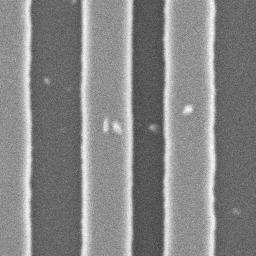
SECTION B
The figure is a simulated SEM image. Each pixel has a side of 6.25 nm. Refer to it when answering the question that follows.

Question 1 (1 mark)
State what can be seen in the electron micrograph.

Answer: lines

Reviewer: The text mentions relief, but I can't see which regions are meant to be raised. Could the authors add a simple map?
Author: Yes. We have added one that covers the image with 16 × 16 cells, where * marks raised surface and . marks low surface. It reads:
**...***..***...
**...***..***...
**...***..***...
**...***..***...
**...***..***...
**...***..***...
**...***..***...
**...***..***...
**...***..***...
**...***..***...
**...***..***...
**...***..***...
**...***..***...
**...***..***...
**...***..***...
**...***..***...